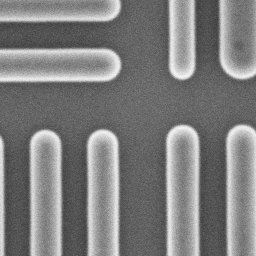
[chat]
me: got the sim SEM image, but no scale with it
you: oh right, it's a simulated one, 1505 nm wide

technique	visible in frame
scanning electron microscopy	groups of lines, slits or small figures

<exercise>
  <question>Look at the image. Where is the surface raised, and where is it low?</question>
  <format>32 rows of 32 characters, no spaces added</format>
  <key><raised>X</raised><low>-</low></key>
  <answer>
XXXXXXXXXXXXXXX------XXX----XXXX
XXXXXXXXXXXXXXX------XXX----XXXX
XXXXXXXX-------------XXX----XXXX
---------------------XXX----XXXX
---------------------XXX----XXXX
---------------------XXX----XXXX
XXXXXXXXXXXXXX-------XXX----XXXX
XXXXXXXXXXXXXXX------XXX----XXXX
XXXXXXXXXXXXXXX------XXX----XXXX
XXXXXXXXXXXXXX--------XX-----XX-
--------------------------------
--------------------------------
--------------------------------
--------------------------------
--------------------------------
--------------------------------
---------------------XXX-----XXX
----XXX----XXX-------XXXX----XXX
----XXX----XXXX------XXXX---XXXX
----XXX----XXXX------XXXX----XXX
----XXX----XXXX------XXXX----XXX
----XXX----XXXX------XXXX----XXX
----XXX----XXXX------XXXX----XXX
----XXX----XXXX------XXXX----XXX
----XXX----XXXX------XXXX----XXX
----XXX----XXXX------XXXX----XXX
----XXX----XXXX------XXXX----XXX
----XXX----XXXX------XXXX----XXX
----XXX----XXXX------XXXX----XXX
----XXX----XXXX------XXXX----XXX
----XXX----XXXX------XXXX----XXX
----XXX----XXXX------XXXX----XXX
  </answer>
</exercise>